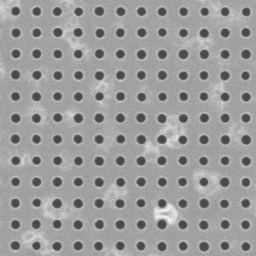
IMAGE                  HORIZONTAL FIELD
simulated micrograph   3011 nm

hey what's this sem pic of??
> a regular array of holes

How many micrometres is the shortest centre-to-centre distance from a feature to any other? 0.244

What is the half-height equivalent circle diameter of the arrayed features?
0.11 um